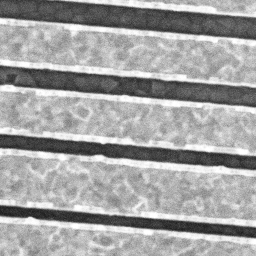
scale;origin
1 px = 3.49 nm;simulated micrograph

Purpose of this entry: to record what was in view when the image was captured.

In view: one or a few lines or trenches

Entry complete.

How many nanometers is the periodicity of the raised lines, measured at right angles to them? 235